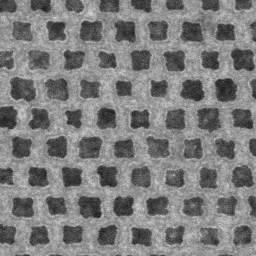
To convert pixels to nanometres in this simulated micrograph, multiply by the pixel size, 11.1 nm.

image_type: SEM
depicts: a regular array of holes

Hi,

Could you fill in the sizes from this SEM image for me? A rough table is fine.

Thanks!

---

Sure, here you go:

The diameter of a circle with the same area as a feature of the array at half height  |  246 nm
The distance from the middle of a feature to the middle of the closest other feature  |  364 nanometres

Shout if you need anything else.